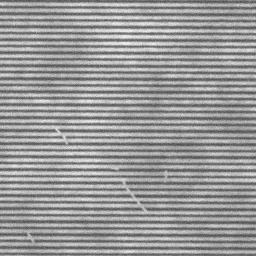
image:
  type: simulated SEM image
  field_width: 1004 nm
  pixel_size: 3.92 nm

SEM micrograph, parallel lines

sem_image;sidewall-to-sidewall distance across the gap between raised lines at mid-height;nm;14.7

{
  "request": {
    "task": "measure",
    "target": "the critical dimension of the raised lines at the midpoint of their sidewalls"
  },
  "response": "0.0118 microns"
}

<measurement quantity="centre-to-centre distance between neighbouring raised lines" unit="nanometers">25.5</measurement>